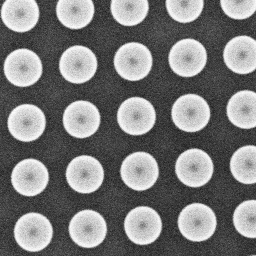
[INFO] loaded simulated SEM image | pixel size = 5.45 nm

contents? an array of small figures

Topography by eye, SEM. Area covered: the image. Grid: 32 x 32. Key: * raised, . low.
.****..*****..****...****...****
*****..*****..****...****...****
*****..****....***....**........
.***.....*......................
................................
................**....***...****
..**....***....****..*****..****
.****...****..*****..*****..****
.****..*****..*****..****....***
.****...****...***.....*........
..**............................
..............................**
................**....****...***
..***...****...****...****..****
.*****..****...****..*****...***
.*****..****...****...****...***
.****...****....**..............
...*............................
..............................**
..........*.....***....***...***
..***....***...*****..*****..***
..****..*****..*****..*****..***
..****..*****..*****...***....**
..****...***....**..............
................................
..............................**
..........**....***....****..***
..****...****...****..*****..***
..****...****...****..*****...**
..****...****...****...***.....*
..****....**.....*..............
................................